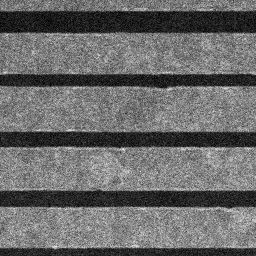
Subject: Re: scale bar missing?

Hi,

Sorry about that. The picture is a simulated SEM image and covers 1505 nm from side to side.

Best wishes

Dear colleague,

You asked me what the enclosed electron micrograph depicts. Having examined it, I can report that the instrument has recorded parallel lines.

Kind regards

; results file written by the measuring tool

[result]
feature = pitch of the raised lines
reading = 341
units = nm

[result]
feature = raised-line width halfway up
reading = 239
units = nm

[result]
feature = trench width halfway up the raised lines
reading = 99.9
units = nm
